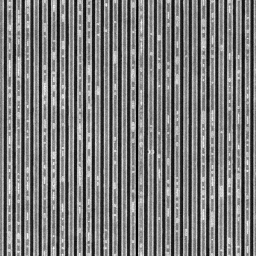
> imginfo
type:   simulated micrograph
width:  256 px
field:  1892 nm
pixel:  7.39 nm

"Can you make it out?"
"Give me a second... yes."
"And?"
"parallel lines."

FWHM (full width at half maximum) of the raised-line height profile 33.3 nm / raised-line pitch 65.1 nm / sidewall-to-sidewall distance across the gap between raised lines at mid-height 33.3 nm